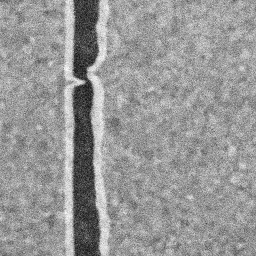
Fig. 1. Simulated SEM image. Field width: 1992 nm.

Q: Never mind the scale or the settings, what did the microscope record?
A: one or a few lines or trenches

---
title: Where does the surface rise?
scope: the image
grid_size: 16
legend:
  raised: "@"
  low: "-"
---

@@@@---@@@@@@@@@
@@@@--@@@@@@@@@@
@@@@--@@@@@@@@@@
@@@@--@@@@@@@@@@
@@@@--@@@@@@@@@@
@@@@@-@@@@@@@@@@
@@@@--@@@@@@@@@@
@@@@--@@@@@@@@@@
@@@@--@@@@@@@@@@
@@@@--@@@@@@@@@@
@@@@--@@@@@@@@@@
@@@@--@@@@@@@@@@
@@@@--@@@@@@@@@@
@@@@--@@@@@@@@@@
@@@@---@@@@@@@@@
@@@@---@@@@@@@@@